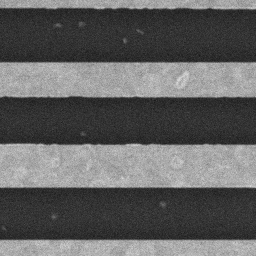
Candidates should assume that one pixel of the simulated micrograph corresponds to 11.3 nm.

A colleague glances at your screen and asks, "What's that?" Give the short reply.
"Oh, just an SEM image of lines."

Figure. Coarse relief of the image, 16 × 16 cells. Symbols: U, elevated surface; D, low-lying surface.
DDDDDUUUUUUDUUUU
DDDDDDDDDDDDDDDD
DDDDDDDDDDDDDDDD
DDDDDDDDDDDDDDDD
UUUUUUUUUUUUUUUU
UUUUUUUUUUUUUUUU
DDDDDDDDDDDDDDDD
DDDDDDDDDDDDDDDD
DDDDDDDDDDDDDDDD
UUUUUUUUUUUUUUUU
UUUUUUUUUUUUUUUU
UUUUUUUUUUUUUUUU
DDDDDDDDDDDDDDDD
DDDDDDDDDDDDDDDD
DDDDDDDDDDDDDDDD
UUUUUUUUUUUUUUUU